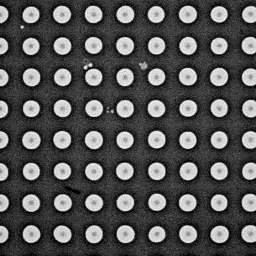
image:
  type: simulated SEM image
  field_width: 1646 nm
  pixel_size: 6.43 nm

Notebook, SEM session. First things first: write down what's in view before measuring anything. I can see an array of small figures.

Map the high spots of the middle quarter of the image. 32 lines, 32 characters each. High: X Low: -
--------------------------------
X-----XX------XX------XX------XX
XX----XXX----XXXX----XXXX----XXX
XX----XXX----XXXX----XXXX----XXX
X-----XXX-----XXX----XXXX----XXX
--------------------------------
--------------------------------
--------------------------------
--------------------------------
X-----XXX-----XXX-----XX------XX
XX----XXXX---XXXX----XXXX----XXX
XX----XXXX---XXXX----XXXX----XXX
X-----XXX-----XXX----XXXX-----XX
--------------------------------
--------------------------------
--------------------------------
--------------------------------
X-----XXX-----XXX-----XXX-----XX
XX---XXXXX---XXXX----XXXX----XXX
XX---XXXXX---XXXX----XXXX----XXX
X-----XXX-----XXX-----XXX----XXX
--------------------------------
--------------------------------
--------------------------------
--------------------------------
X-----XXX-----XXX-----XXX-----XX
XX---XXXXX---XXXX----XXXX----XXX
XX---XXXX----XXXX----XXXX----XXX
X-----XXX-----XX------XX------XX
--------------------------------
--------------------------------
--------------------------------